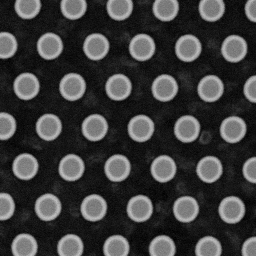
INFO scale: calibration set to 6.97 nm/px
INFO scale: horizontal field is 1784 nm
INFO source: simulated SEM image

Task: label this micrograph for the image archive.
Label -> a regular array of raised bodies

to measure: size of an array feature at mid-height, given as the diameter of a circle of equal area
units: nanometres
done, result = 168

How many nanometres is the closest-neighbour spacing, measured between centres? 320